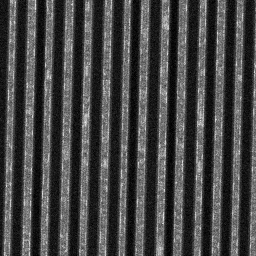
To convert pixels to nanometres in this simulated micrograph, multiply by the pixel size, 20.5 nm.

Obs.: parallel lines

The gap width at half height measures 0.218 micrometres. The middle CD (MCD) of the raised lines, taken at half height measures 0.179 micrometres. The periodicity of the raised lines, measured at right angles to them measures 388 nm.